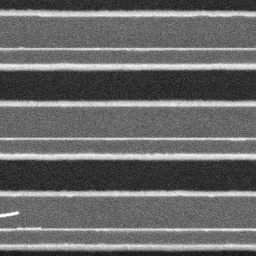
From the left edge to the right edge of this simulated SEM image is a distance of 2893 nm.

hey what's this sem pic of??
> lines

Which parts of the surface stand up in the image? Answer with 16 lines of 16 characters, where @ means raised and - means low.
----------------
@@@@@@@@@@@@@@@@
@@@@@@@@@@@@@@@@
@@@@@@@@@@@@@@@@
----------------
----------------
----------------
@@@@@@@@@@@@@@@@
@@@@@@@@@@@@@@@@
@@@@@@@@@@@@@@@@
----------------
----------------
@@@@@@@@@@@@@@@@
@@@@@@@@@@@@@@@@
@@@@@@@@@@@@@@@@
----------------